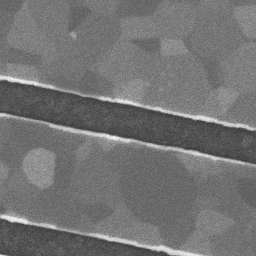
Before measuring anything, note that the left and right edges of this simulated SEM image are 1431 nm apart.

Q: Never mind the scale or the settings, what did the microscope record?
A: one or a few lines or trenches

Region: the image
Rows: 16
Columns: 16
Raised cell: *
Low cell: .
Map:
****************
****************
****************
****************
****************
...*************
........********
**..........****
*******.........
************....
****************
****************
****************
****************
.....***********
.........*******